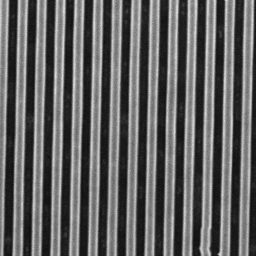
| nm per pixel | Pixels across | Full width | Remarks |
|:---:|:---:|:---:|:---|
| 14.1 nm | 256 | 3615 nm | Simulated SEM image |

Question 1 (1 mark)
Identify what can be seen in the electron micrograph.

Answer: parallel lines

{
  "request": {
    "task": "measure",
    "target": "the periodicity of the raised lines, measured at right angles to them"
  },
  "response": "266 nanometers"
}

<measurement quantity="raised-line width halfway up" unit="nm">139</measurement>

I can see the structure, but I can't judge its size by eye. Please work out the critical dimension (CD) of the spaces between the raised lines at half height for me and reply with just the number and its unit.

125 nm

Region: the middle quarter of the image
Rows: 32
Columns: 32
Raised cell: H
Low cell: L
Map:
LLHHHLLHHHLLHHLLHHHLLHHHLLHHLLLH
LLHHHLLHHLLLHHLLHHHLLHHHLLHHLLLH
LLHHHLLHHLLLHHLLHHHLLHHHLLHHLLLH
LLHHHLLHHLLLHHLLHHHLLHHLLLHHLLLH
LLHHHLLHHLLLHHLLHHHLLHHLLLHHLLLH
LLHHLLLHHLLLHHLLHHHLLHHLLLHHLLLH
LLHHLLLHHLLLHHLLHHLLLHHLLLHHLLLH
LLHHLLLHHLLLHHLLHHLLLHHLLLHHLLLH
LLHHHLLHHLLLHHLLHHLLLHHLLLHHLLLH
LLHHHLLHHLLLHHLLHHLLLHHLLLHHLLHH
LLHHHLLHHLLLHHLLHHLLLHHLLLHHLLHH
LLHHHLLHHLLLHHLLHHHLLHHLLLHHLLHH
LLHHHLLHHLLLHHLLHHHLLHHLLLHHLLHH
LLHHHLLHHLLLHHLLHHHLLHHLLHHHLLHH
LLHHHLLHHLLLHHLLHHHLLHHLLHHHLLHH
LLHHHLLHHLLLHHLLHHHLLHHLLLHHLLHH
LLHHLLLHHLLHHHLLHHHLLHHLLLHHLLHH
LLHHLLLHHLLHHHLLHHHLLHHLLLHHLLHH
LLHHLLLHHLLHHHLLHHLLLHHLLLHHLLHH
LLHHLLLHHLLHHHLLHHLLLHHLLLHHLLHH
LLHHLLLHHLLHHHLLHHLLLHHLLLHHLLHH
LLHHLLLHHLLHHHLLHHLLLHHLLLHHLLHH
LLHHLLLHHLLHHLLLHHLLLHHLLLHHLLHH
LLHHLLLHHLLHHLLLHHLLLHHLLLHHLLHH
LLHHLLLHHLLHHLLLHHLLLHHLLHHHLLHH
LLHHLLLHHLLHHLLLHHLLLHHLLHHHLLHH
LLHHLLHHHLLHHLLLHHLLLHHLLHHHLLHH
LLHHLLHHHLLHHLLLHHLLLHHLLHHHLLHH
LLHHLLHHHLLHHLLLHHLLLHHLLHHHLLHH
LLHHLLHHHLLHHLLLHHLLLHHLLHHHLLHH
LLHHLLHHHLLHHLLLHHLLLHHLLHHHLLHH
LLHHLLHHHLLHHLLLHHLLLHHLLHHHLLHH